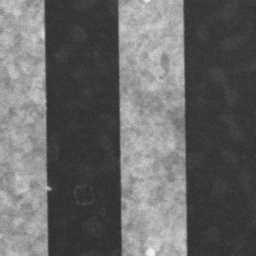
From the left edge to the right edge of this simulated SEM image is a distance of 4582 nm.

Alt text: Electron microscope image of one or a few lines or trenches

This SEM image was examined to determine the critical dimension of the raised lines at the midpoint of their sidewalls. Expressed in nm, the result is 1140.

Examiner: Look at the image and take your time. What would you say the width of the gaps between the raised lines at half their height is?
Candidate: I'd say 1340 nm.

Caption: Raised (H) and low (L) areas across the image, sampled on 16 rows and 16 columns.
HHHLLLLHHHHLLLLL
HHHLLLLHHHHLLLLL
HHHLLLLHHHHLLLLL
HHHLLLLHHHHLLLLL
HHHLLLLHHHHLLLLL
HHHLLLLLHHHLLLLL
HHHLLLLLHHHLLLLL
HHHLLLLLHHHHLLLL
HHHLLLLLHHHHLLLL
HHHLLLLLHHHHLLLL
HHHLLLLLHHHHLLLL
HHHLLLLLHHHHLLLL
HHHLLLLLHHHHLLLL
HHHLLLLLHHHHLLLL
HHHLLLLLHHHHLLLL
HHHLLLLLHHHHLLLL